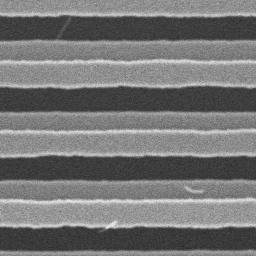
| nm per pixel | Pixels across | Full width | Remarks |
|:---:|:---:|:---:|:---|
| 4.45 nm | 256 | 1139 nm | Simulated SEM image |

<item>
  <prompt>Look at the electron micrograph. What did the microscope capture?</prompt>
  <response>lines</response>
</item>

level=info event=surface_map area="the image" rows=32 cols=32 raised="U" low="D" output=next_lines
UUUUUUUUUUUUUUUUUUUUUUUUUUUUUUUU
UUUUUUUUUUUUUUUUUUUUUUUUUUUUUUUU
DDDDDDDDDDDDDDDDDDDDDDDDDDDDDDDD
DDDDDDDDDDDDDDDDDDDDDDDDDDDDDDDD
DDDDDDDDDDDDDDDDDDDDDDDDDDDDDDDD
UUUUUUUUUUUUUUUUUUUUUUUUUUUUUUUU
UUUUUUUUUUUUUUUUUUUUUUUUUUUUUUUU
UUUUUUUUUUUUUUUUUUUUUUUUUUUUUUUU
UUUUUUUUUUUUUUUUUUUUUUUUUUUUUUUU
UUUUUUUUUUUUUUUUUUUUUUUUUUUUUUUU
UUUUUUUUUUUUUUUUUUUUUUUUUUUUUUUU
DDDDDDDDDDDDDDDDDDDDDDDDDDDDDDDD
DDDDDDDDDDDDDDDDDDDDDDDDDDDDDDDD
DDDDDDDDDDDDDDDDDDDDDDDDDDDDDDDD
UUUUUUUUUUUUUUUUUUUUUUUUUUUUUUUU
UUUUUUUUUUUUUUUUUUUUUUUUUUUUUUUU
UUUUUUUUUUUUUUUUUUUUUUUUUUUUUUUU
UUUUUUUUUUUUUUUUUUUUUUUUUUUUUUUU
UUUUUUUUUUUUUUUUUUUUUUUUUUUUUUUU
UUUUUDDDDDDDDDDDDDDDDDDDUUUDDDDD
DDDDDDDDDDDDDDDDDDDDDDDDDDDDDDDD
DDDDDDDDDDDDDDDDDDDDDDDDDDDDDDDD
DDDDDDDDDDDDDDDDDDDDDDDDDDDDDDDD
UUUUUUUUUUUUUUUUUUUUUUUUUUUUUUUU
UUUUUUUUUUUUUUUUUUUUUUUUUUUUUUUU
UUUUUUUUUUUUUUUUUUUUUUUUUUUUUUUU
UUUUUUUUUUUUUUUUUUUUUUUUUUUUUUUU
UUUUUUUUUUUUUUUUUUUUUUUUUUUUUUUU
DDDDDDDDDDDDDDDDDDDDDDDDDDDDDDDD
DDDDDDDDDDDDDDDDDDDDDDDDDDDDDDDD
DDDDDDDDDDDDDDDDDDDDDDDDDDDDDDDD
UUUUUUUUUUUUUUUUUUUUUUUUUUUUUUUU